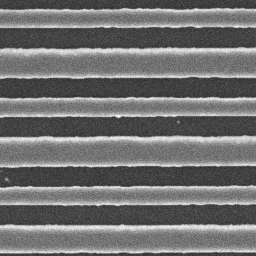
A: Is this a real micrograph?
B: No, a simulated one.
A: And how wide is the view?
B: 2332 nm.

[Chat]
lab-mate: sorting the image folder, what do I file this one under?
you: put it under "lines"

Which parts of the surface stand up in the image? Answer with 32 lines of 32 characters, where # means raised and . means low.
................................
################################
################################
................................
................................
................................
################################
################################
################################
################################
................................
................................
################################
################################
######################..........
................................
................................
################################
################################
################################
################################
................................
................................
################################
################################
##########################.#####
................................
................................
################################
################################
################################
##########.####.##.#..##........